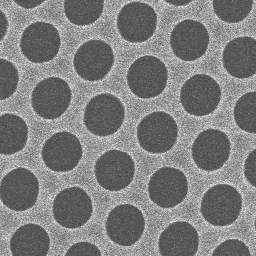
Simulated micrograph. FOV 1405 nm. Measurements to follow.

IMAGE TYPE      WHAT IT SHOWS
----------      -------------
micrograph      a regular array of holes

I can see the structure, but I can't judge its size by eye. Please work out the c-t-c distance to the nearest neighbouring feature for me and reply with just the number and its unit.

306 nm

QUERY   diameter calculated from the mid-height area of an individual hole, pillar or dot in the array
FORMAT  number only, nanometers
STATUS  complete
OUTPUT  224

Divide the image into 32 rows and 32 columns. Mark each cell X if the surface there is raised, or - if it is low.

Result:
XX---XXX-----XXX--XXX--XXXX-----
XXXXXXXX-----XX----XXXXXXXX----X
-XXXXXXXX---XXX-----XXX-XXXX--XX
-XX----XXXXXXXX----XXX----XXXXXX
-XX----XXXXXXXX----XX-----XXXXXX
XXX-----XX---XXXXXXXX-----XX----
XXX----XXX----XXXXXXXX----XX----
-XXX--XXX-----XXX---XXX-XXXX----
--XXXXXXX-----XX-----XXXXXXX----
--XXXXXXXX---XXX-----XXX--XXX--X
--XXX---XXXXXXXX-----XX----XXXXX
--XX-----XXXXXXXX---XXX-----XXX-
XXXX-----XX----XXXXXXXX-----XX--
XXXX----XXX----XXXXXXXX----XX---
--XXX--XXX------XX---XXXXXXXX---
---XXXXXXXX----XX-----XXXXXXXX--
---XXXXXXXX---XXX-----XXX---XXX-
---XXX----XXXXXXX-----XX-----XXX
---XX-----XXXXXXXX---XXX-----XXX
XXXXX-----XXX---XXXXXXXX-----XX-
XXXXXX----XX-----XXXXXXXX---XXX-
X---XXX-XXXX-----XX----XXXXXXXX-
-----XXXXXXX----XXX----XXXXXXXX-
-----XXXX-XXX---XXX----XXX---XXX
-----XX----XXXXXXXX----XX-----XX
----XXX----XXXXXXXX---XXX-----XX
XXXXXXX-----XX----XXXXXXX-----XX
XXXXXXX----XX-----XXXXXXXX---XXX
XX---XXX-XXXX-----XXX---XXXXXXXX
XX----XXXXXXXX----XX-----XXXXXXX
X-----XXX---XXX--XXX-----XXX---X
X-----XX-----XXXXXXX----XXX----X